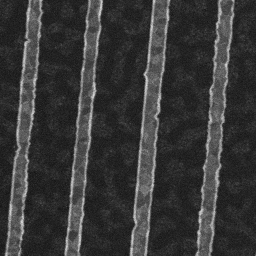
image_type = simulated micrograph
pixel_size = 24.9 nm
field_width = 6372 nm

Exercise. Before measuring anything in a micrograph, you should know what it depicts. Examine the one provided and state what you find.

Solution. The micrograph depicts one or a few lines or trenches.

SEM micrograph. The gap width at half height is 1280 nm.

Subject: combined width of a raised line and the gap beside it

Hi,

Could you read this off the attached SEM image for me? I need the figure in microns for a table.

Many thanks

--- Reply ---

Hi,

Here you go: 1.58